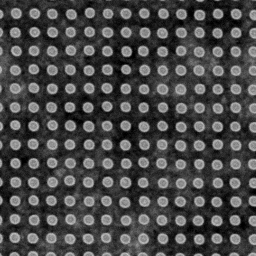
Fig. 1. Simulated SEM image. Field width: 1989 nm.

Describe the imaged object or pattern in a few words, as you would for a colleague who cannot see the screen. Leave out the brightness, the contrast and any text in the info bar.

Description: a regular array of raised bodies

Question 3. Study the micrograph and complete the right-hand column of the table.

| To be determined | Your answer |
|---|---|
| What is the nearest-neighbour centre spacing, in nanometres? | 139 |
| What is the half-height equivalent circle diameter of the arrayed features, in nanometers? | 79.4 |